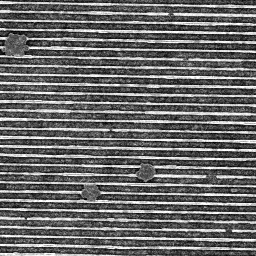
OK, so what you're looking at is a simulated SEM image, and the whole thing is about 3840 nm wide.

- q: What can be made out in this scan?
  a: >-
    parallel lines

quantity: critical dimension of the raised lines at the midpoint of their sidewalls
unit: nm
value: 24.4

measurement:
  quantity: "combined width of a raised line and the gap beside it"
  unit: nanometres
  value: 135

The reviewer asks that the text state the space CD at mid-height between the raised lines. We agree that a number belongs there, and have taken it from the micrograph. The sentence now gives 0.103 micrometres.